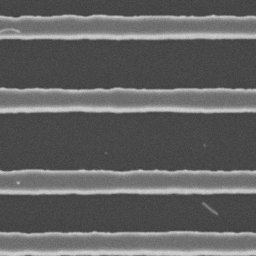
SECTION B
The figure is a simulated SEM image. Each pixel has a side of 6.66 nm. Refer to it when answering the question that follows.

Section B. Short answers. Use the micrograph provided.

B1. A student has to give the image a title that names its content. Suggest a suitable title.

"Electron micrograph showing lines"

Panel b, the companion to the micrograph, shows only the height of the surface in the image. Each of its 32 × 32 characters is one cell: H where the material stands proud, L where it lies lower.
LLLLLLLLLLLLLLLLLLLLLLLLLLLLLLLL
LLLLLLLLLLLLLLLLLLLLLLLLLLLLLLLL
HHHHHHHHHHHHHHHHHHHHHHHHHHHHHHHH
HHHHHHHHHHHHHHHHHHHHHHHHHHHHHHHH
HHHHHHHHHHHHHHHHHHHHHHHHHHHHHHHH
LLLLLLLLLLLLLLLLLLLLLLLLLLLLLLLL
LLLLLLLLLLLLLLLLLLLLLLLLLLLLLLLL
LLLLLLLLLLLLLLLLLLLLLLLLLLLLLLLL
LLLLLLLLLLLLLLLLLLLLLLLLLLLLLLLL
LLLLLLLLLLLLLLLLLLLLLLLLLLLLLLLL
LLLLLLLLLLLLLLLLLLLLLLLLLLLLLLLL
HHHHHHHHHHHHHHHHHHHHHHHHHHHHHHHH
HHHHHHHHHHHHHHHHHHHHHHHHHHHHHHHH
HHHHHHHHHHHHHHHHHHHHHHHHHHHHHHHH
LLLLLLLLLLLLLLLLLLLLLLLLLLLLLLLL
LLLLLLLLLLLLLLLLLLLLLLLLLLLLLLLL
LLLLLLLLLLLLLLLLLLLLLLLLLLLLLLLL
LLLLLLLLLLLLLLLLLLLLLLLLLLLLLLLL
LLLLLLLLLLLLLLLLLLLLLLLLLLLLLLLL
LLLLLLLLLLLLLLLLLLLLLLLLLLLLLLLL
LLLLLLLLLLLLLLLLLLLLLLLLLLLLLLLL
HHHHHHHHHHHHHHHHHHHHHHHHHHHHHHHH
HHHHHHHHHHHHHHHHHHHHHHHHHHHHHHHH
HHHHHHHHHHHHHHHHHHHHHHHHHHHHHHHH
LLLLLLLLLLLLLLLLLLLLLLLLLLLLLLLL
LLLLLLLLLLLLLLLLLLLLLLLLLLLLLLLL
LLLLLLLLLLLLLLLLLLLLLLLLLLLLLLLL
LLLLLLLLLLLLLLLLLLLLLLLLLLLLLLLL
LLLLLLLLLLLLLLLLLLLLLLLLLLLLLLLL
HHHHHHHHHHHHHHHHHHHHHHHHHHHHHHHH
HHHHHHHHHHHHHHHHHHHHHHHHHHHHHHHH
HHHHHHHHHHHHHHHHHHHHHHHHHHHHHHHH